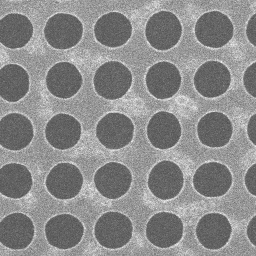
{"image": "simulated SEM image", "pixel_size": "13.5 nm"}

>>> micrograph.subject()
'a regular array of holes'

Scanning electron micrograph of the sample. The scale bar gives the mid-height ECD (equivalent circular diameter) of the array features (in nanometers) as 501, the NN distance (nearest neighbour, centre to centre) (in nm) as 658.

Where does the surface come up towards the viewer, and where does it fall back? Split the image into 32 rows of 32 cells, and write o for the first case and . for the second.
oooooooooooooooooooooooooooooooo
oooooooooooooooooooo.ooooo..oooo
....oo....oo....ooo...ooo....oo.
....oo....oo....oo.....o.....oo.
....oo....oo....oo.....o.....oo.
...ooo....ooo...ooo...ooo...ooo.
oooooooooooooooooooooooooooooooo
oooooooooooooooooooooooooooooooo
...ooo....oo....ooo...ooo...ooo.
....oo....oo....oo.....o.....o..
....oo....oo....oo.....o.....o..
...ooo....oo....ooo...ooo...ooo.
o.oooooooooooooooooooooooooooooo
oooooooooooooooooooooooooooooooo
o..oooo..oooo...ooo...ooo...oooo
....oo....oo.....oo...ooo....oo.
....oo....oo.....o.....oo....oo.
....oo....oo.....oo...ooo....oo.
o..oooo..oooo..ooooo.ooooooooooo
oooooooooooooooooooooooooooooooo
o.ooooo..oooo..ooooo..oooo..oooo
....oo....oo....ooo....o.....oo.
....oo....oo....oo.....o.....oo.
....oo....oo....ooo....o.....oo.
o..oooo..oooo..oooo...oooo.ooooo
oooooooooooooooooooooooooooooooo
oooooooooooooo.ooooo.ooooooooooo
....oo....oo....ooo....oo...ooo.
....oo....oo.....o.....oo....oo.
....oo....oo....oo.....oo....oo.
....oo....oo....ooo...ooo...oooo
oooooooooooooooooooooooooooooooo